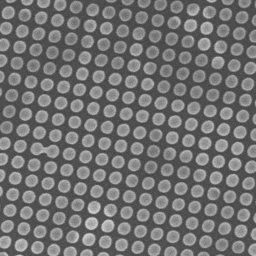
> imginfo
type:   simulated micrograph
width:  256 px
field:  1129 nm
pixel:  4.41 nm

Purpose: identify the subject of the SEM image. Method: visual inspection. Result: a regular array of raised bodies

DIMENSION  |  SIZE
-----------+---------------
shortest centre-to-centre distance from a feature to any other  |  71.1 nm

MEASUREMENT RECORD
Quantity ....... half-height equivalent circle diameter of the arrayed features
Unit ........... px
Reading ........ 12.3